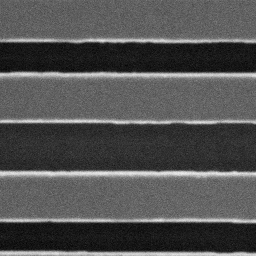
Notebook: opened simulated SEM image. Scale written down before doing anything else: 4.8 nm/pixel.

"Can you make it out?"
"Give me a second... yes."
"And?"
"lines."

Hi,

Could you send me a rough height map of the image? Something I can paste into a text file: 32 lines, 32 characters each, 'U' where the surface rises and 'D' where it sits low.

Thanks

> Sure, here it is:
UUUUUUUUUUUUUUUUUUUUUUUUUUUUUUUU
UUUUUUUUUUUUUUUUUUUUUUUUUUUUUUUU
UUUUUUUUUUUUUUUUUUUUUUUUUUUUUUUU
UUUUUUUUUUUUUUUUUUUUUUUUUUUUUUUU
UUUUUUUUUUUUUUUUUUUUUUUUUUUUUUUU
DDDDDDDDDDDDDDDDDDDDDDDDDDDDDDDD
DDDDDDDDDDDDDDDDDDDDDDDDDDDDDDDD
DDDDDDDDDDDDDDDDDDDDDDDDDDDDDDDD
DDDDDDDDDDDDDDDDDDDDDDDDDDDDDDDD
UUUUUUUUUUUUUUUUUUUUUUUUUUUUUUUU
UUUUUUUUUUUUUUUUUUUUUUUUUUUUUUUU
UUUUUUUUUUUUUUUUUUUUUUUUUUUUUUUU
UUUUUUUUUUUUUUUUUUUUUUUUUUUUUUUU
UUUUUUUUUUUUUUUUUUUUUUUUUUUUUUUU
UUUUUUUUUUUUUUUUUUUUUUUUUUUUUUUU
DDDDDDDDDDDDDDDDDDDDDDDDDDDDDDDD
DDDDDDDDDDDDDDDDDDDDDDDDDDDDDDDD
DDDDDDDDDDDDDDDDDDDDDDDDDDDDDDDD
DDDDDDDDDDDDDDDDDDDDDDDDDDDDDDDD
DDDDDDDDDDDDDDDDDDDDDDDDDDDDDDDD
DDDDDDDDDDDDDDDDDDDDDDDDDDDDDDDD
UUUUUUUUUUUUUUUUUDUDUUUUUDUDDDDD
UUUUUUUUUUUUUUUUUUUUUUUUUUUUUUUU
UUUUUUUUUUUUUUUUUUUUUUUUUUUUUUUU
UUUUUUUUUUUUUUUUUUUUUUUUUUUUUUUU
UUUUUUUUUUUUUUUUUUUUUUUUUUUUUUUU
UUUUUUUUUUUUUUUUUUUUUUUUUUUUUUUU
UUUUUUUUUUUUUUUUUUUUUUUUUUUUUUUU
DDDDDDDDDDDDDDDDDDDDDDDDDDDDDDDD
DDDDDDDDDDDDDDDDDDDDDDDDDDDDDDDD
DDDDDDDDDDDDDDDDDDDDDDDDDDDDDDDD
UUUUUUUUDUUDDDDDDDDDDDDDDDDDDDDD